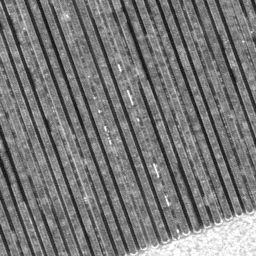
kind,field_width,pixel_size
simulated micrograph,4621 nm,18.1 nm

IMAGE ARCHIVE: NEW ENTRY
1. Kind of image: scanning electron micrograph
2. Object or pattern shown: parallel lines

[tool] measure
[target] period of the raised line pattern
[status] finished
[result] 0.202 um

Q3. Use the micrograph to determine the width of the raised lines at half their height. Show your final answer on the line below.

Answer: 132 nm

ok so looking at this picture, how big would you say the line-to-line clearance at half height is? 3.76 px